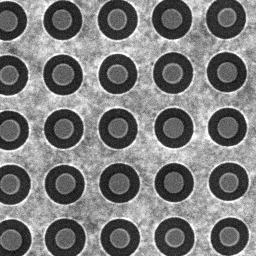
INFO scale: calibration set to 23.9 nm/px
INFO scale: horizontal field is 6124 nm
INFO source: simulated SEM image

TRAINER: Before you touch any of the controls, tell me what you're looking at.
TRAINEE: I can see an array of small figures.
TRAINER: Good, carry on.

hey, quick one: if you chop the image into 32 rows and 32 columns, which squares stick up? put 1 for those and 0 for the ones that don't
00111100011110001111000111000011
00011100001100000110000011000001
00011000001100000110000011000001
00011100001100000110000011000011
00011100011110001111000111100011
11111111111111111111111111111111
11111111111111111111101111110111
00011100001110000111000011000011
00011000001100000110000011000001
00001000001100000110000011000001
00011100001110000110000011000011
00011100011110001111100111110111
11111111111111111111111111111111
11111111111111111111101111110111
00011100001110000111000011000001
00001100001100000110000011000001
00001100001100000110000011000001
00011100001110000111000011100011
00111110011111001111100111111111
11111111111111111111111111111111
11111111111111001111100111110011
00011100001110000111000011000001
00001100000100000110000011000001
00001100000100000110000011000001
00011100001110000111000011100011
00111110011111111111111111111111
11111111111111111111111111111111
10111110011111001111100111110011
00001100001110000111000011100001
00001100000110000010000011000001
00001100000110000110000011000001
00011100001110000111000011100011